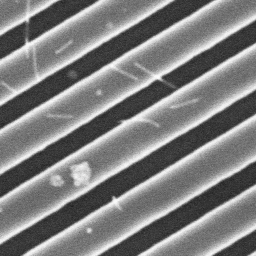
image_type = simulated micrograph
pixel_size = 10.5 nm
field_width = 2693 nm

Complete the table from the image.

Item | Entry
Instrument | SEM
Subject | lines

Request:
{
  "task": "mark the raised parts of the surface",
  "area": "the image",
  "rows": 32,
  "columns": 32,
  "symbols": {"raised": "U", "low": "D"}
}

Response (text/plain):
UUUUUUDDDDDDUUUUUUUUUDDDDDUUUUUU
UUUUUDDDDDUUUUUUUUUDDDDDUUUUUUUU
UUUDDDDDUUUUUUUUUUDDDDDUUUUUUUUU
UDDDDDDUUUUUUUUUDDDDDUUUUUUUUUDD
DDDDDUUUUUUUUUDDDDDUUUUUUUUUDDDD
DDDUUUUUUUUUUDDDDDUUUUUUUUUDDDDD
DDUUUUUUUUUDDDDDUUUUUUUUUDDDDDUU
UUUUUUUUUDDDDDUUUUUUUUUUDDDDUUUU
UUUUUUUUDDDDDUUUUUUUUUDDDDDUUUUU
UUUUUUDDDDDUUUUUUUUUDDDDDUUUUUUU
UUUUDDDDDUUUUUUUUUUDDDDDUUUUUUUU
UUUDDDDDUUUUUUUUUDDDDDUUUUUUUUUD
UDDDDDUUUUUUUUUDDDDDUUUUUUUUUUDD
DDDDDUUUUUUUUUDDDDDUUUUUUUUUDDDD
DDDUUUUUUUUUDDDDDUUUUUUUUUDDDDDD
DUUUUUUUUUDDDDDUUUUUUUUUUDDDDDUU
UUUUUUUUUDDDDDUUUUUUUUUDDDDDUUUU
UUUUUUUDDDDDUUUUUUUUUDDDDDDUUUUU
UUUUUDDDDDUUUUUUUUUUDDDDDUUUUUUU
UUUUDDDDDUUUUUUUUUDDDDDUUUUUUUUU
UUDDDDDUUUUUUUUUDDDDDDUUUUUUUUUD
DDDDDUUUUUUUUUUDDDDDUUUUUUUUUUDD
DDDDUUUUUUUUUDDDDDUUUUUUUUUUDDDD
DDUUUUUUUUUUDDDDDUUUUUUUUUDDDDDU
UUUUUUUUUUDDDDDUUUUUUUUUDDDDDDUU
UUUUUUUUDDDDDUUUUUUUUUUDDDDDUUUU
UUUUUUUDDDDDUUUUUUUUUDDDDDUUUUUU
UUUUUDDDDDUUUUUUUUUDDDDDDUUUUUUU
UUUDDDDDDUUUUUUUUUDDDDDUUUUUUUUU
UUDDDDDUUUUUUUUUDDDDDUUUUUUUUUDD
DDDDDUUUUUUUUUUDDDDDUUUUUUUUUDDD
DDDDUUUUUUUUUDDDDDUUUUUUUUUDDDDD